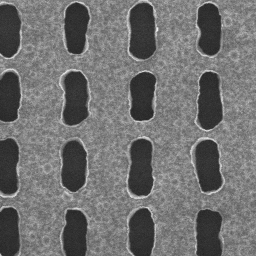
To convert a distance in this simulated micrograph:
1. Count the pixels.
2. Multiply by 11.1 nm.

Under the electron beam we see a regular array of holes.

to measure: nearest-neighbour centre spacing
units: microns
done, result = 0.739